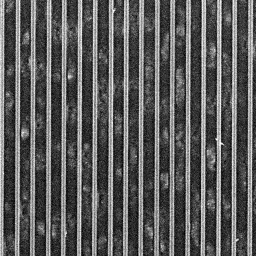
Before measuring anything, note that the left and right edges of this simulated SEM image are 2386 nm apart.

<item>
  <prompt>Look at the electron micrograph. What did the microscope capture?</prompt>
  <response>parallel lines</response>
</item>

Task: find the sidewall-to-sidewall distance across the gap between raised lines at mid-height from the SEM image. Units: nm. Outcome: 112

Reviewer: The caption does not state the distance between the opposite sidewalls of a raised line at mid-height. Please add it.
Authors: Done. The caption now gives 35 nm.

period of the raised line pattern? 15.5 pixels